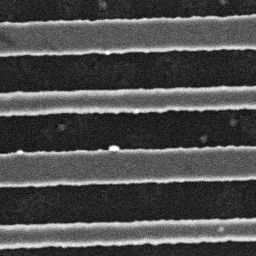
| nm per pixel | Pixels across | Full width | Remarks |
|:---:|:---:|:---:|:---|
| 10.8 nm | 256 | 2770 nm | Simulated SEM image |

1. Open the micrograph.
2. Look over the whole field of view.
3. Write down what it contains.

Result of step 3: lines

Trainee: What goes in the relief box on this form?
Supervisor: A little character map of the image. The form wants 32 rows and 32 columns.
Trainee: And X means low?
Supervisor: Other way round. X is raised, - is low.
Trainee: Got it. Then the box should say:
--------------------------------
--------------------------------
-------------XXXXXXXXXXXXXXXXXXX
XXXXXXXXXXXXXXXXXXXXXXXXXXXXXXXX
XXXXXXXXXXXXXXXXXXXXXXXXXXXXXXXX
XXXXXXXXXXXXXXXXXXXXXXXXXXXXXXXX
XXXXXXXXXXXXXXXX--X-------------
--------------------------------
--------------------------------
--------------------------------
--------------------------------
--X--XXXXXXXXXXXXXXXXXXXXXXXXXXX
XXXXXXXXXXXXXXXXXXXXXXXXXXXXXXXX
XXXXXXXXXXXXXXXXXXXXXXXXXXXXXXXX
X-------------------------------
--------------------------------
--------------------------------
--------------------------------
--------------X----------X-XXXXX
XXXXXXXXXXXXXXXXXXXXXXXXXXXXXXXX
XXXXXXXXXXXXXXXXXXXXXXXXXXXXXXXX
XXXXXXXXXXXXXXXXXXXXXXXXXXXXXXXX
XXXXXXXXXXXXXXXXXXXXXXXXXXXXX---
--------------------------------
--------------------------------
--------------------------------
--------------------------------
--------------------------XXXXXX
XXXXXXXXXXXXXXXXXXXXXXXXXXXXXXXX
XXXXXXXXXXXXXXXXXXXXXXXXXXXXXXXX
XXXXXXXXXXXXXXXXX--X------------
--------------------------------